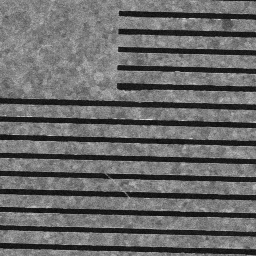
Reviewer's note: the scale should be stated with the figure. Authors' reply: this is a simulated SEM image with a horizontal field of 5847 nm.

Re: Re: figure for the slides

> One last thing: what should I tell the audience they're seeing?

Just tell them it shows parallel lines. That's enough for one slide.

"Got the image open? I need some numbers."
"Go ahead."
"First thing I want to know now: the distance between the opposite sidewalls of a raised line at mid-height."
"0.283 microns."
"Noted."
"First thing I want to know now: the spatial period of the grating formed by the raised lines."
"414 nanometers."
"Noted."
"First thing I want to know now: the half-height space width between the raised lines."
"134 nm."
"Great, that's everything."